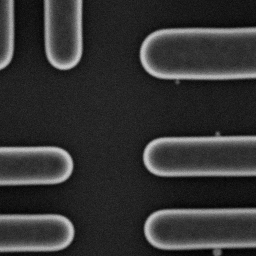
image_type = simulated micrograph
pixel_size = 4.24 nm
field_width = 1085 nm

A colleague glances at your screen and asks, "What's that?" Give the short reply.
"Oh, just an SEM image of groups of lines, slits or small figures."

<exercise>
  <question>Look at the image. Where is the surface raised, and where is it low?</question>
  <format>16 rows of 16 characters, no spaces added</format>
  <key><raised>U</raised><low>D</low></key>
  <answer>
UDDUUDDDDDDDDDDD
UDDUUDDDDDDDDDDD
UDDUUDDDDUUUUUUU
UDDUUDDDDUUUUUUU
DDDDDDDDDUUUUUUU
DDDDDDDDDDDDDDDD
DDDDDDDDDDDDDDDD
DDDDDDDDDDDDDDDD
DDDDDDDDDDDDDDDD
UUUUDDDDDUUUUUUU
UUUUDDDDDUUUUUUU
DDDDDDDDDDDDDDDD
DDDDDDDDDDDDDDDD
DDDDDDDDDDUUUUUU
UUUUDDDDDUUUUUUU
UUUUDDDDDDDDDDDD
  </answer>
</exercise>